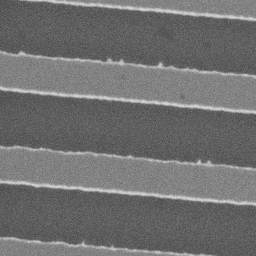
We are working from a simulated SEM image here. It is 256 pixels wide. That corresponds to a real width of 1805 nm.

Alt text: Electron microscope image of lines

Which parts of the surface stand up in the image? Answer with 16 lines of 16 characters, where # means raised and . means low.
.......#########
................
................
##..............
##############..
################
..........######
................
................
####............
###############.
.###############
............####
................
................
#######.........